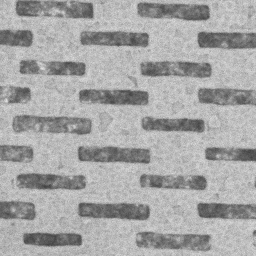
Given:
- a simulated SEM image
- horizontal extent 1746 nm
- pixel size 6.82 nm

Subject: a regular array of holes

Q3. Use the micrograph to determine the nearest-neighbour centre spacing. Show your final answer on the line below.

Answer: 389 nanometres